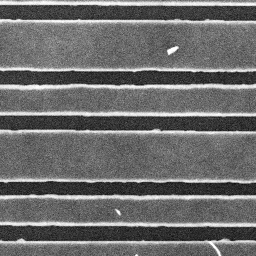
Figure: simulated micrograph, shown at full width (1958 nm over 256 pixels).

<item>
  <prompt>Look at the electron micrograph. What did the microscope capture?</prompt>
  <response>lines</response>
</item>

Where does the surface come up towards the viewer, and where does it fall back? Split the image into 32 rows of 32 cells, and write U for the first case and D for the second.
DDDDDDDDDUDDDUUUUUUUUUUUUUUUUUUU
DDDDDDDDDDDDDDDDDDDDDDDDDDDDDDDD
DDDDDDDDDDDDDDDDDDDDDDDDDDDDDDDD
UUUUUUUUUUUUUUUUUUUUUUUUUUUUUUUU
UUUUUUUUUUUUUUUUUUUUUUUUUUUUUUUU
UUUUUUUUUUUUUUUUUUUUUUUUUUUUUUUU
UUUUUUUUUUUUUUUUUUUUUUUUUUUUUUUU
UUUUUUUUUUUUUUUUUUUUUUUUUUUUUUUU
UUUUUUUUUUUUUUUUUUUUUUUUUUUUUUUU
DDDDDDDDDDDDDDDDDDDDDDDDDDDDDDDD
DDDDDDDDDDDDDDDDDDDDDDDDDDDDDDDD
UUUUUUUUUUUUUUUUUUUUUUUUUUUUUUUU
UUUUUUUUUUUUUUUUUUUUUUUUUUUUUUUU
UUUUUUUUUUUUUUUUUUUUUUUUUUUUUUUU
DDDDDDDDDDDDDDDDDDDDDDDDDDDDDDDD
DDDDDDDDDDDDDDDDDDDDDDDDDDDDDDDD
UUUUUUUUUUUUUUUUUUUUDDDDDDDDDDDD
UUUUUUUUUUUUUUUUUUUUUUUUUUUUUUUU
UUUUUUUUUUUUUUUUUUUUUUUUUUUUUUUU
UUUUUUUUUUUUUUUUUUUUUUUUUUUUUUUU
UUUUUUUUUUUUUUUUUUUUUUUUUUUUUUUU
UUUUUUUUUUUUUUUUUUUUUUUUUUUUUUUU
UUUUUUUUUUUUUUUUUUUUUUUUUUUUUUUU
DDDDDDDDDDDDDDDDDDDDDDDDDDDDDDDD
DDDUUUUDDDDDDDUDDDDDDDDDDDDDDDDD
UUUUUUUUUUUUUUUUUUUUUUUUUUUUUUUU
UUUUUUUUUUUUUUUUUUUUUUUUUUUUUUUU
UUUUUUUUUUUUUUUUUUUUUUUUUUUUUUUU
DDDDDDDDDDDDDDDDDDDDDDDDDDDDDDDD
DDDDDDDDDDDDDDDDDDDDDDDDDDDDDDDD
UUUUUUUUUUUUUUUUUUUUUUUUUUUUUUUU
UUUUUUUUUUUUUUUUUUUUUUUUUUUUUUUU